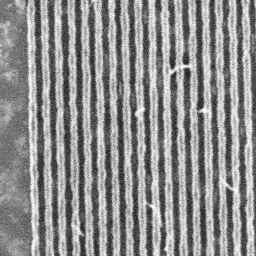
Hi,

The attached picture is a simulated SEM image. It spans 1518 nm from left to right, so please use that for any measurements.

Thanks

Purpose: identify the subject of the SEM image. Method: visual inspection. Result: parallel lines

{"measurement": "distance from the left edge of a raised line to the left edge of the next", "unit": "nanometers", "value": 79.6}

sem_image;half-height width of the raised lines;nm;30.4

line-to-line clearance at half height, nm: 50.4